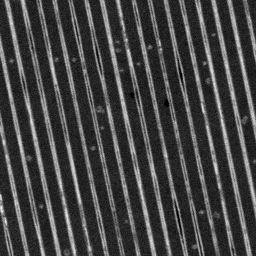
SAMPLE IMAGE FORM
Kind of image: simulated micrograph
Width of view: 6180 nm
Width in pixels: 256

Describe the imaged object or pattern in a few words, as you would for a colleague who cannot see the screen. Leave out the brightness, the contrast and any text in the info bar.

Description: parallel lines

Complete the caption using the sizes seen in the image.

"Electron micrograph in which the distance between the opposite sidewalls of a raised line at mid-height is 0.065 µm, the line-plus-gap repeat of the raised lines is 376 nm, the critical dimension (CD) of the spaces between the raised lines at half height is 0.313 micrometres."